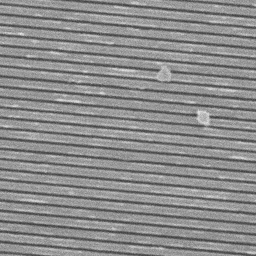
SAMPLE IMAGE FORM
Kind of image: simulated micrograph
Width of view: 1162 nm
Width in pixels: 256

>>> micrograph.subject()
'parallel lines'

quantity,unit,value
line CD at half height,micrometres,0.0327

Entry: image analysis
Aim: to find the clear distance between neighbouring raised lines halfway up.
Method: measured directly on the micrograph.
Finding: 16.4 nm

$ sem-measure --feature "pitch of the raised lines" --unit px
10.3